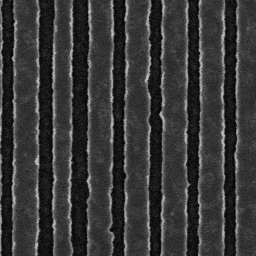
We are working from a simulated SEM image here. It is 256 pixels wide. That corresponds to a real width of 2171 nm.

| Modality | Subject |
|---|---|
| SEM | parallel lines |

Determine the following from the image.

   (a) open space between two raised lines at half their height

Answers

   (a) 107 nanometers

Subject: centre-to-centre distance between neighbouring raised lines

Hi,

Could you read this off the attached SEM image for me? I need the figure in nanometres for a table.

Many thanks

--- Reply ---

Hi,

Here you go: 315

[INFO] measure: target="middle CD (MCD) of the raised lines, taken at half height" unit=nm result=214